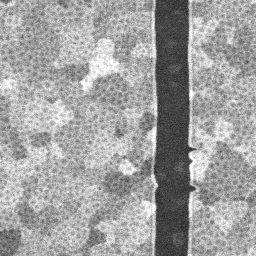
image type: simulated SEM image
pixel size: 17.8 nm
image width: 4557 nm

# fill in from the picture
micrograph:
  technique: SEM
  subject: one or a few lines or trenches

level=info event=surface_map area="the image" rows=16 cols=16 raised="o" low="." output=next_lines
oooooooooo..oooo
oooooooooo..oooo
oooooooooo..oooo
oooooooooo..oooo
oooooooooo..oooo
oooooooooo..oooo
oooooooooo..oooo
oooooooooo..oooo
oooooooooo..oooo
oooooooooo..oooo
oooooooooo..oooo
oooooooooo..oooo
oooooooooo..oooo
oooooooooo..oooo
oooooooooo..oooo
oooooooooo..oooo